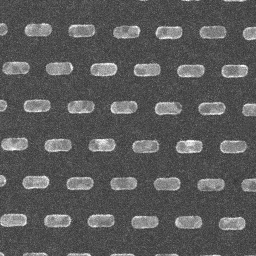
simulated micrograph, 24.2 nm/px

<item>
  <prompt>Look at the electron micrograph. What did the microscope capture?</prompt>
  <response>a regular array of raised bodies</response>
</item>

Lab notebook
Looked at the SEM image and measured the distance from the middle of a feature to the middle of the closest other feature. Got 1.04 µm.